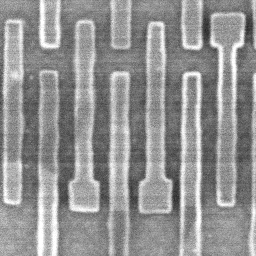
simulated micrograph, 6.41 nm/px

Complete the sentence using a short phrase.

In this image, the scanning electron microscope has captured wiring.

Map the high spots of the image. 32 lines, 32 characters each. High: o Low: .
.....oo.......oo.......oo.......
.....oo.......oo.......oo.......
.....oo.......oo.......oo.ooooo.
.oo..oo...oo..oo...o...oo.ooooo.
.oo..oo...oo..oo..oo...oo.ooooo.
.oo..oo...oo..oo..oo...oo.oooo..
.oo.......oo......ooo......ooo..
.oo.......oo......ooo......oo...
.oo.......oo......ooo......oo...
.oo..oo...o...oo..ooo..oo..oo...
.oo..oo...o...oo..oo...oo..oo...
.oo..oo...oo..oo..oo...oo..oo...
.oo..oo..ooo..oo..oo...oo..oo...
.oo..oo..ooo..oo..oo...oo..oo...
.oo..oo..ooo..oo..ooo..oo..oo...
.oo..oo..ooo..oo..ooo..oo..oo...
.oo..oo..oo...oo..ooo..oo..oo...
.oo..oo..oo...oo..oo...oo..oo...
.oo..oo..oo...oo..oo...oo..oo...
.oo..oo..oo...oo..oo...oo..oo...
.oo..oo...o...oo..oo...oo..oo...
.oo..oo..ooo..oo..ooo..oo..oo...
.oo..oo..ooo..oo..ooo..oo..oo...
.oo..oo..ooo..oo.oooo..oo..oo...
.oo..oo..ooo..oo.oooo..oo..oo...
.....oo..ooo..oo.oooo..oo..oo...
.....oo.......oo..ooo..oo.......
.....oo.......oo.......oo.......
.....oo.......oo.......oo......o
.....oo.......oo.......oo......o
.....oo.......oo.......oo......o
.....oo.......oo.......oo.......